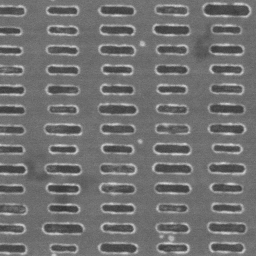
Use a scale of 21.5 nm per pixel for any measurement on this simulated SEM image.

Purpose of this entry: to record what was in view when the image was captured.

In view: a regular array of holes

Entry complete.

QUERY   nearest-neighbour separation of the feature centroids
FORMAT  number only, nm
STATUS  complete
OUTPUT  425